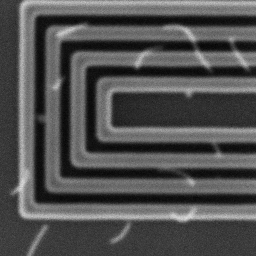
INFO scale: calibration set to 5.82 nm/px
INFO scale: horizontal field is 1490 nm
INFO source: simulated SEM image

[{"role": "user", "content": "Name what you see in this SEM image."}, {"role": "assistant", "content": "groups of lines, slits or small figures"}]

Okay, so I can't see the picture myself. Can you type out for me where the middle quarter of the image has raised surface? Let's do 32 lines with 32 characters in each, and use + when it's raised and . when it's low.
..++++............+.............
..+++...........................
..+++...........................
..+++...........................
..+++....+++++++++++++++++++++++
..+++...++++++++++++++++++++++++
..+++...++++++++++++.....++++++.
..+++...++++....................
..+++...+++.....................
..+++...+++.....................
..+++...+++.....................
..+++...+++.....................
..+++...+++.....................
..+++...+++.....................
..+++...+++.....................
..+++...++++....................
..+++...++++++++++++++++++++++++
..+++...++++++++++++++++++++++++
..+++....+++++++++++++++++++++++
..+++...........................
..+++...........................
..+++...........................
..++++..........................
..++++++++++++++++++++++++++++++
..++++++++++++++++++++++++++++++
......++++++++++++++++++++++++++
................................
................................
................................
++++++++++++++++++++++++++++++++
++++++++++++++++++++++++++++++++
++++++++++++++++++++++++++++++++